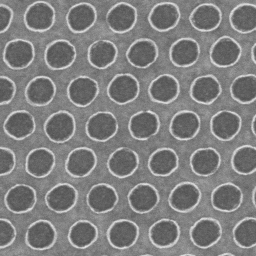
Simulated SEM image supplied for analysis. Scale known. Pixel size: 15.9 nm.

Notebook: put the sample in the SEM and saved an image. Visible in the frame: a regular array of raised bodies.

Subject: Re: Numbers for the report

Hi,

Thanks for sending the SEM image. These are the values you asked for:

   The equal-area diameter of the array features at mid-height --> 459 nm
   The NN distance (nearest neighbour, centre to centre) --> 646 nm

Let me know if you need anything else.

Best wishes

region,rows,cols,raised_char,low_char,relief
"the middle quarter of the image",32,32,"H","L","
HLLLLLLLHHHLLLLLLLHHHLLLLLLLLHLL
LLLLLLLLLLLLLLLLLLLLLLLLLLLLLLLL
LLLLLLLLLLLLLLLLLLLLLLLLLLLLLLLL
LLLHHHLLLLLLLHHHHLLLLLLHHHHLLLLL
LLHHHHHHLLLLHHHHHHLLLLHHHHHHLLLL
LHHHHHHHLLLHHHHHHHLLLLHHHHHHLLLL
LHHHHHHHLLLHHHHHHHHLLHHHHHHHHLLL
LHHHHHHHLLLHHHHHHHLLLHHHHHHHLLLL
LHHHHHHHLLLLHHHHHHLLLLHHHHHHLLLL
LLHHHHHLLLLLLHHHLLLLLLLLHHLLLLLL
LLLLLLLLLLLLLLLLLLLLLLLLLLLLLLLL
LLLLLLLLLLLLLLLLLLLLLLLLLLLLLLLL
HLLLLLLLHHHHLLLLLLHHHHHLLLLLHHHH
HHLLLLHHHHHHHLLLLHHHHHHLLLLHHHHH
HHLLLLHHHHHHHLLLLHHHHHHHLLLHHHHH
HHHLLLHHHHHHHLLLHHHHHHHLLLLHHHHH
HHHLLLHHHHHHHLLLLHHHHHHLLLLHHHHH
HHLLLLHHHHHHHLLLLHHHHHHLLLLHHHHH
HLLLLLLHHHHLLLLLLLHHHLLLLLLLHHHH
LLLLLLLLLLLLLLLLLLLLLLLLLLLLLLLL
LLLLLLLLLLLLLLLLLLLLLLLLLLLLLLLL
LLLHHHLLLLLLLHHHHLLLLLLLHHHLLLLL
LLHHHHHLLLLLHHHHHHLLLLHHHHHHLLLL
LHHHHHHHLLLHHHHHHHLLLLHHHHHHLLLL
LHHHHHHHLLLHHHHHHHLLLHHHHHHHLLLL
HHHHHHHHLLLHHHHHHHLLLHHHHHHHLLLL
LHHHHHHLLLLHHHHHHHLLLLHHHHHLLLLL
LLHHHHLLLLLLLHHHLLLLLLLHHHLLLLLL
LLLLLLLLLLLLLLLLLLLLLLLLLLLLLLLL
LLLLLLLLLLLLLLLLLLLLLLLLLLLLLLLL
HHLLLLLLHHHLLLLLLLHHHHLLLLLLHHHH
HHHLLLLHHHHHLLLLLHHHHHHLLLLHHHHH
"